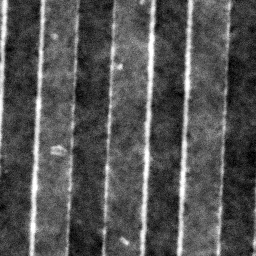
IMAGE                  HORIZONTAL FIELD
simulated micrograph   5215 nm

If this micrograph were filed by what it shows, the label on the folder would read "lines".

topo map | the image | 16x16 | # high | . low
...##..###..##..
...##..##...##..
...##..##...##..
...##..##...##..
...##..##...##..
..###..##...##..
..###..##...##..
..###..##...##..
..###..##...##..
..##...##...##..
..##...##...##..
..##...##..###..
..##...##..###..
..##...##..###..
..##...##..###..
..##..###..###..